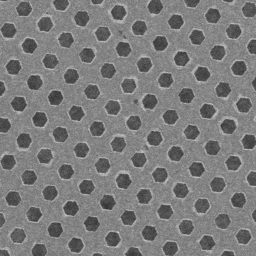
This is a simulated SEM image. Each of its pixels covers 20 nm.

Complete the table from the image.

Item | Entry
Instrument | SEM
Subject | a regular array of holes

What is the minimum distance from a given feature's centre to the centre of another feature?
517 nanometres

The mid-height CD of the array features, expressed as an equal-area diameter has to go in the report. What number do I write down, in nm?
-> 315